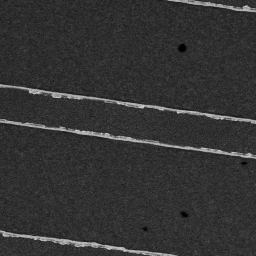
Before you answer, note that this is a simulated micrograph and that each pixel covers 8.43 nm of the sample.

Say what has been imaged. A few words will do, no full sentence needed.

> one or a few lines or trenches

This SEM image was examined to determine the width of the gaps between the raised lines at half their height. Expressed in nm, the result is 909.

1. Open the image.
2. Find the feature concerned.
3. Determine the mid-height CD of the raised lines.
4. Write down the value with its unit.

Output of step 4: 36.9 px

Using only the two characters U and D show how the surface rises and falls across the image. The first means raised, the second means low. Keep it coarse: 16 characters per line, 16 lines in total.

DDDDDDDDDDDDDDUU
DDDDDDDDDDDDDDDD
DDDDDDDDDDDDDDDD
DDDDDDDDDDDDDDDD
DDDDDDDDDDDDDDDD
UUDDDDDDDDDDDDDD
UUUUUUUUDDDDDDDD
UUUUUUUUUUUUUUUU
DDDDDDUUUUUUUUUU
DDDDDDDDDDDDDUUU
DDDDDDDDDDDDDDDD
DDDDDDDDDDDDDDDD
DDDDDDDDDDDDDDDD
DDDDDDDDDDDDDDDD
DDDDDDDDDDDDDDDD
UUUUUUUUDDDDDDDD